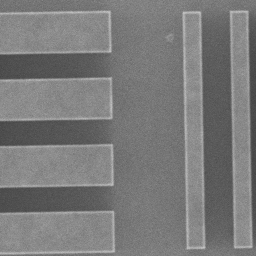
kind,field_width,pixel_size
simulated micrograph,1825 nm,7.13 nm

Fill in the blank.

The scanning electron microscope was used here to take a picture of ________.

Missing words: groups of lines, slits or small figures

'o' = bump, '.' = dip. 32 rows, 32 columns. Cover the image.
................................
............o................oo.
oooooooooooooo.........oo....oo.
oooooooooooooo.........oo....oo.
oooooooooooooo.........oo....oo.
oooooooooooooo.........oo....oo.
ooooooooooo............oo....oo.
.......................oo....oo.
.......................oo....oo.
.......................oo....oo.
oooooooooooooo.........oo....oo.
oooooooooooooo.........oo....oo.
oooooooooooooo.........oo....oo.
oooooooooooooo.........oo....oo.
oooooooooooooo.........oo....oo.
.......................oo....oo.
.......................oo....oo.
.......................oo....oo.
oooooooooooooo.........oo....oo.
oooooooooooooo.........oo....oo.
oooooooooooooo.........oo....oo.
oooooooooooooo.........oo....oo.
oooooooooooooo.........oo....oo.
.......................oo....oo.
.......................oo....oo.
.......................oo....oo.
.............o.........oo....oo.
oooooooooooooo.........oo....oo.
oooooooooooooo.........ooo...oo.
oooooooooooooo.........ooo...oo.
oooooooooooooo.........ooo...oo.
oooooooooooo....................